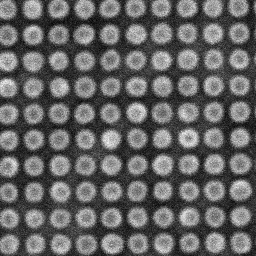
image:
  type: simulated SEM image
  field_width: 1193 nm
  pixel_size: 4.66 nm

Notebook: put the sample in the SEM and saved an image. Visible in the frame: a regular array of raised bodies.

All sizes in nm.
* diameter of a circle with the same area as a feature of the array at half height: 85.9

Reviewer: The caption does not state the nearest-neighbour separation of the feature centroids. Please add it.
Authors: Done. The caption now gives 119 nm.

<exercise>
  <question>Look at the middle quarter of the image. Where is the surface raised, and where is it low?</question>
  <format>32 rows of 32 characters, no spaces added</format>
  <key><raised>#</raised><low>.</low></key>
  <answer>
#..####...###...####..####...###
................................
................................
........................##....##
#..####...####..####...####..###
#..#####.#####..####..#####..###
#..#####..####..####..#####..###
...####....##....##....###....##
................................
................................
....##....###....###...###...###
#..####...###...####..#####..###
#..####..#####..#####.#####..###
#..####...####..####...###...###
....#......#....................
................................
.................##............#
#...###...####..####...###...###
#..#####..####..####...####..###
#..####...####..####...####..###
....###...###....###...###....##
................................
................................
....###....##....###...####...##
#..####...####..####...####..###
#..####..#####..####..#####..###
#..####...####..####...####..###
.....##....##...........##......
................................
................................
#...###...####...###...###...###
#..#####..####..####...####..###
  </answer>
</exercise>